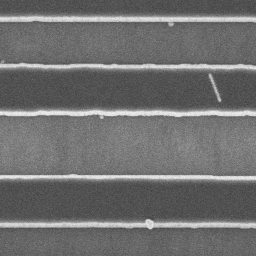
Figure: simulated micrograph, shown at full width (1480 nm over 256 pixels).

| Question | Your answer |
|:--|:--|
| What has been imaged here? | lines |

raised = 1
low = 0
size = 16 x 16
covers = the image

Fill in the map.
1111111111111111
0000000000000000
0000000000000000
0000000000000000
1111111111111111
1111111111111111
1111111111111111
0000000000000000
0000000000000000
0000000000000000
0000000000000000
1111111111111111
1111111111111111
1111111111111111
0000000000000000
0000000000000000